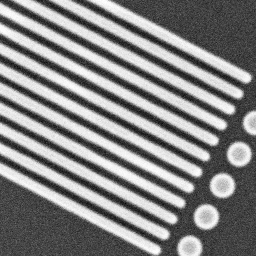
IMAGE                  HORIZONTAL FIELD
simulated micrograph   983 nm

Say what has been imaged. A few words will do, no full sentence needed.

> groups of lines, slits or small figures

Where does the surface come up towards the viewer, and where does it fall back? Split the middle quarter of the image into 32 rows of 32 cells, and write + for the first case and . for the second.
++++.....+++++.....++++.....++++
..++++.....++++.....+++++.....++
....++++.....++++.....+++++.....
......++++.....++++.....+++++...
++.....+++++.....++++.....++++..
+++......++++.....+++++.....++++
..++++.....++++.....+++++.....++
....++++.....++++.....+++++.....
......++++.....++++.....+++++...
++.....+++++.....++++.....+++++.
++++.....+++++.....++++.....++++
.+++++.....++++......++++.....++
...+++++.....++++.....+++++....+
.....+++++.....++++.....+++++...
++.....+++++.....+++++....+++++.
++++.....+++++.....++++.....++++
..++++.....+++++.....++++.....++
...+++++.....++++.....+++++.....
.....+++++.....++++.....+++++...
++.....++++......++++.....+++++.
++++.....++++......++++.....++++
.+++++......+++......+++++....++
...+++++.....++++......++++.....
+....++++......++++.....+++++...
++.....++++......++++.....+++++.
++++.....++++......++++.....++++
.+++++.....++++......++++.....++
...+++++.....++++......+++......
+....+++++.....++++......++++...
++.....+++++.....++++......++++.
++++.....+++++.....++++.....++++
.+++++.....++++......++++.....++